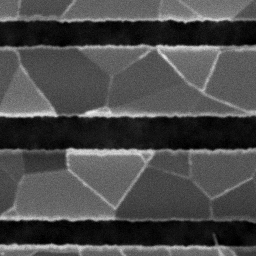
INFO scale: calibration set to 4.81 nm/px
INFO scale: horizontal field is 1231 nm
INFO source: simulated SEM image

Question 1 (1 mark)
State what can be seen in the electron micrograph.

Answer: lines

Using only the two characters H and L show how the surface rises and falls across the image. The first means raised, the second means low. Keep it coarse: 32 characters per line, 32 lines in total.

HHHHHHHHHHHHHHHHHHHHHHHHHHHHHHHH
HHHHHHHHHHHHHHHHHHHHHHHHHHHHHHHH
HHHHHHHHHHHHHHHHHHHHHLHHHHHHHHHH
LLLLLLLLLLLLLLLLLLLLLLLLLLLLLLLL
LLLLLLLLLLLLLLLLLLLLLLLLLLLLLLLL
LLLLLLLLLLLLLLLLLLLLLLLLLLLLLLLL
HHHHHHHHHHHHHHHHHHHHHHHHHHHHHHHH
HHHHHHHHHHHHHHHHHHHHHHHHHHHHHHHH
HHHHHHHHHHHHHHHHHHHHHHHHHHHHHHHH
HHHHHHHHHHHHHHHHHHHHHHHHHHHHHHHH
HHHHHHHHHHHHHHHHHHHHHHHHHHHHHHHH
HHHHHHHHHHHHHHHHHHHHHHHHHHHHHHHH
HHHHHHHHHHHHHHHHHHHHHHHHHHHHHHHH
HHHHHHHHHHHHHHHHHHHHHHHHHHHHHHHH
HHHHLLLLLLHHLHHLHHHLLHHLHLLHLHHL
LLLLLLLLLLLLLLLLLLLLLLLLLLLLLLLL
LLLLLLLLLLLLLLLLLLLLLLLLLLLLLLLL
LLLLLLLLLLLLLLLLLLLLLLLLLLLLLLLL
LLLLLLLLLLLLLLLLLLLLLLLLLLLLLLLL
HHHHHHHHHHHHHHHHHHHHHHHHHHHHHHHH
HHHHHHHHHHHHHHHHHHHHHHHHHHHHHHHH
HHHHHHHHHHHHHHHHHHHHHHHHHHHHHHHH
HHHHHHHHHHHHHHHHHHHHHHHHHHHHHHHH
HHHHHHHHHHHHHHHHHHHHHHHHHHHHHHHH
HHHHHHHHHHHHHHHHHHHHHHHHHHHHHHHH
HHHHHHHHHHHHHHHHHHHHHHHHHHHHHHHH
HHHHHHHHHHHHHHHHHHHHHHHHHHHHHHHH
LLLLLLHLLHLLLLLLHHLHHLLLHHLHHLHH
LLLLLLLLLLLLLLLLLLLLLLLLLLLLLLLL
LLLLLLLLLLLLLLLLLLLLLLLLLLLLLLLL
LLLLLLLLLLLLLLLLLLLLLLLLLLLLLLLL
HHHHHHHHHHHHHHHHHHHHHHHHHHHHHHHH